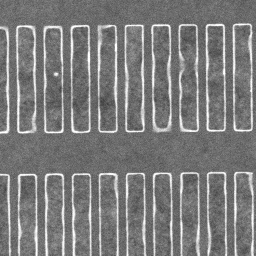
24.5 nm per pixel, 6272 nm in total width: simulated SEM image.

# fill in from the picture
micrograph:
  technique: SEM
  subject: groups of lines, slits or small figures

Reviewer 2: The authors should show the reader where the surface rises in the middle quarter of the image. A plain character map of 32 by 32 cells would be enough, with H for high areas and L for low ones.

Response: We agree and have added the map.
LLHHHHLLLHHHHLLLHHHLLLLHHHLLLLHH
LLHHHHLLLHHHHLLLHHHLLLHHHHLLLLHH
LLHHHHLLLHHHHLLLHHHLLLHHHHLLLHHH
LLHHHHLLLHHHHLLLHHHHLLHHHHLLLHHH
LLHHHHLLLHHHHLLLHHHHLLHHHHLLLHHH
LLHHHHLLLHHHHLLLHHHHLLHHHHLLLHHH
LLHHHHLLLHHHHLLLHHHHLLHHHHLLLHHH
LLHHHHLLLHHHHLLLHHHHLLHHHHLLLHHH
LLHHHHLLLHHHHLLLHHHHLLHHHHLLLHHH
LLHHHHLLLHHHHLLLHHHHLLHHHHLLLHHH
LLHHHHLLLHHHHLLLHHHLLLLHHHLLLHHH
LLHHHHLLLHHHHLLLHHHLLLLHHHLLLHHH
LLHHHHLLLHHHHLLLHHHLLLLHHHLLLHHH
LLHHHHLLLHHHHLLLHHHLLLLHHHLLLHHH
LLHHHHLLLHHHHLLLHHHHLLLHHHLLLHHH
LLHHHHLLLHHHHLLLHHHHLLLHHHLLLHHH
LLHHHHLLLHHHHLLLHHHHLLLLLLLLLLLH
LLLLLLLLLLLLLLLLLLLLLLLLLLLLLLLL
LLLLLLLLLLLLLLLLLLLLLLLLLLLLLLLL
LLLLLLLLLLLLLLLLLLLLLLLLLLLLLLLL
LLLLLLLLLLLLLLLLLLLLLLLLLLLLLLLL
LLLLLLLLLLLLLLLLLLLLLLLLLLLLLLLL
LLLLLLLLLLLLLLLLLLLLLLLLLLLLLLLL
LLLLLLLLLLLLLLLLLLLLLLLLLLLLLLLL
LLLLLLLLLLLLLLLLLLLLLLLLLLLLLLLL
LLLLLLLLLLLLLLLLLLLLLLLLLLLLLLLL
LLLLLLLLLLLLLLLLLLLLLLLLLLLLLLLL
LLLLLLLLLLLLLLLLLLLLLLLLLLLLLLHH
LLHHHHLLLHHHHLLLHHHHLLLHHHLLLHHH
LLHHHHLLLHHHHLLLHHHHLLLHHHHLLLHH
LLHHHHLLLHHHHLLLHHHHLLLHHHHLLLHH
LLHHHHLLLHHHHLLLHHHHLLLHHHHLLHHH